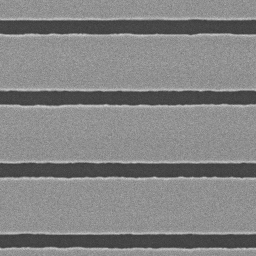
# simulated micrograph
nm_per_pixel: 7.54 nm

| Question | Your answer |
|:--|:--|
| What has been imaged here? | lines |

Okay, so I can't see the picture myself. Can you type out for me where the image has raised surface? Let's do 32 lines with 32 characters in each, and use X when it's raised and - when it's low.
XXXXXXXXXXXXXXXXXXXXXXXXXXXXXXXX
XXXXXXXXXXXXXXXXXXXXXXXXXXXXXXXX
--------------------------------
--------------------------------
XXXXXXXXXXXXXXXXXXXXXXXXXXXXXXXX
XXXXXXXXXXXXXXXXXXXXXXXXXXXXXXXX
XXXXXXXXXXXXXXXXXXXXXXXXXXXXXXXX
XXXXXXXXXXXXXXXXXXXXXXXXXXXXXXXX
XXXXXXXXXXXXXXXXXXXXXXXXXXXXXXXX
XXXXXXXXXXXXXXXXXXXXXXXXXXXXXXXX
XXXXXXXXXXXXXXXXXXXXXXXXXXXXXXXX
--------------------------------
--------------------------------
XXXXXXXXXXXXXXXXXXXXXXXXXXXXXXXX
XXXXXXXXXXXXXXXXXXXXXXXXXXXXXXXX
XXXXXXXXXXXXXXXXXXXXXXXXXXXXXXXX
XXXXXXXXXXXXXXXXXXXXXXXXXXXXXXXX
XXXXXXXXXXXXXXXXXXXXXXXXXXXXXXXX
XXXXXXXXXXXXXXXXXXXXXXXXXXXXXXXX
XXXXXXXXXXXXXXXXXXXXXXXXXXXXXXXX
--------------------------------
--------------------------------
XXXXXXXXXXXXXXXXXXXXXXXXXXXXXXXX
XXXXXXXXXXXXXXXXXXXXXXXXXXXXXXXX
XXXXXXXXXXXXXXXXXXXXXXXXXXXXXXXX
XXXXXXXXXXXXXXXXXXXXXXXXXXXXXXXX
XXXXXXXXXXXXXXXXXXXXXXXXXXXXXXXX
XXXXXXXXXXXXXXXXXXXXXXXXXXXXXXXX
XXXXXXXXXXXXXXXXXXXXXXXXXXXXXXXX
--------------------------------
--------------------------------
XXXXXXXXXXXXXXXXXXXXXXXXXXXXXXXX